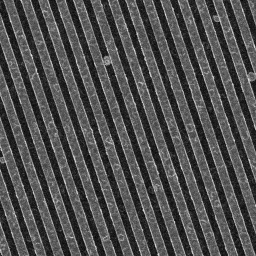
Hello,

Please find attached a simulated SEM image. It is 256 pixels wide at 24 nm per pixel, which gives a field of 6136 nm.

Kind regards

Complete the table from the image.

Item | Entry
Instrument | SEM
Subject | parallel lines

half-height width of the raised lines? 219 nanometres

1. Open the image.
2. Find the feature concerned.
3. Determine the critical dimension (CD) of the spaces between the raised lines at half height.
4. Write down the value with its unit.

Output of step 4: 176 nm